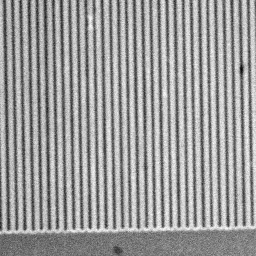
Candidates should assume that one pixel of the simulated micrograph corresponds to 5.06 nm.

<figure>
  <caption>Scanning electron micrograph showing parallel lines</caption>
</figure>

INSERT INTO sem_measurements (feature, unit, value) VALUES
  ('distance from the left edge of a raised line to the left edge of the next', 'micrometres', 0.0411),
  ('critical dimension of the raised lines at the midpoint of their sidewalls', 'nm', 21.5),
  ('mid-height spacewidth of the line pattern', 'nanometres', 21.5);